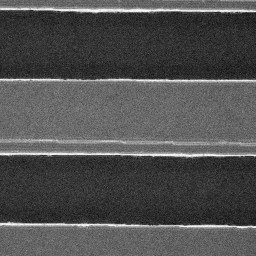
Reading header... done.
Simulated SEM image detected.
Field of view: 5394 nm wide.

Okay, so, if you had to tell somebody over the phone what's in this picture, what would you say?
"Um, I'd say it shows lines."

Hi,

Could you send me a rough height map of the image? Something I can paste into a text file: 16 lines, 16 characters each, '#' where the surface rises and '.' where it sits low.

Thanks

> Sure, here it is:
################
................
................
................
................
################
################
################
################
################
................
................
................
................
################
################